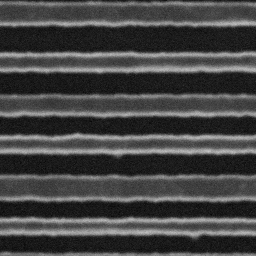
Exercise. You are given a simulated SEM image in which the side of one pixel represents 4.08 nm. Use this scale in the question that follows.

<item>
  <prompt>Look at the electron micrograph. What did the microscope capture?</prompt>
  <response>lines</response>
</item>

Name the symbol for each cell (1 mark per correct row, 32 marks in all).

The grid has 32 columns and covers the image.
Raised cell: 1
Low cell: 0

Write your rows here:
11111111111111111111111111111111
11111111111111111111111111111111
11111111111111111111111111111111
00000000000000000000000000000000
00000000000000000000000000000000
00000000000000000000000000000000
00000000000000000000000000000000
11111111111111111111111111111111
11111111111111111111111111111111
00000000000000000000000000000000
00000000000000000000000000000000
00000000000000000000000000000000
11111111111111111111111111111111
11111111111111111111111111111111
01000000000011010000000000100000
00000000000000000000000000000000
00000000000000000000000000000000
11111111111111111111111111111111
11111111111111111111111111111111
00000000000000000000000000000000
00000000000000000000000000000000
00000000000000000000000000000000
11111111111111111111111111111111
11111111111111111111111111111111
11111111111111111111111111111111
00000000000000000000000000000000
00000000000000000000000000000000
11111111111111011111111111111111
11111111111111111111111111111111
00000000000000000000000000000000
00000000000000000000000000000000
00000000000000000000000000000000